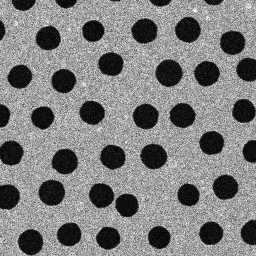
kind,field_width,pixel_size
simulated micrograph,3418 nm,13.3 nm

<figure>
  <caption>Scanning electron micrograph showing a regular array of holes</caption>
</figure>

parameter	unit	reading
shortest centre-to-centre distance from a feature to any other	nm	524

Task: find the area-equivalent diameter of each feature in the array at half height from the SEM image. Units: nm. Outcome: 334